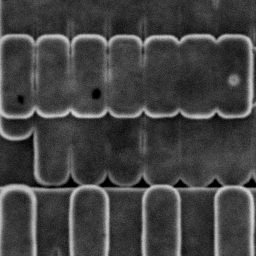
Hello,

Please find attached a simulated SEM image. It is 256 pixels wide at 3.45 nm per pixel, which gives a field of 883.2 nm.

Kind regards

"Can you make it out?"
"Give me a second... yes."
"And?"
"wiring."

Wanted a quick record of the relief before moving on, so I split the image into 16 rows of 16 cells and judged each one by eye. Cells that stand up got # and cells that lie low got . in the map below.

................
................
###############.
################
################
################
################
................
................
................
................
................
##..###..##..###
##..###..##..###
##..###..##..###
##..###..##..###